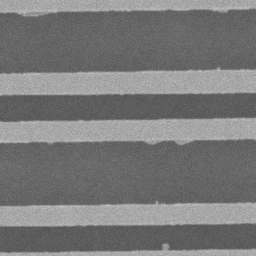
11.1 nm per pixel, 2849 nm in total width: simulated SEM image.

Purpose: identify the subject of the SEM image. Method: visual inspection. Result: lines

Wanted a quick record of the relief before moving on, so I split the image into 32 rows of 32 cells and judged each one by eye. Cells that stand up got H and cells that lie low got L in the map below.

HHHHHHHHHHHHHHHHHHHHHHHHHHHHHHHH
HLLLLLLLLLLLLLLLLLLLLLLLLLLLLLLL
LLLLLLLLLLLLLLLLLLLLLLLLLLLLLLLL
LLLLLLLLLLLLLLLLLLLLLLLLLLLLLLLL
LLLLLLLLLLLLLLLLLLLLLLLLLLLLLLLL
LLLLLLLLLLLLLLLLLLLLLLLLLLLLLLLL
LLLLLLLLLLLLLLLLLLLLLLLLLLLLLLLL
LLLLLLLLLLLLLLLLLLLLLLLLLLLLLLLL
LLLLLLLLLLLLLLLLLLLLLLLLLLLLLLLL
HHHHHHHHHHHHHHHHHHHHHHHHHHHHHHHH
HHHHHHHHHHHHHHHHHHHHHHHHHHHHHHHH
HHHHHHHHHHHHHHHHHHHHHHHHHHHHHHHH
LLLLLLLLLLLLLLLLLLLLLLLLLLLLLLLL
LLLLLLLLLLLLLLLLLLLLLLLLLLLLLLLL
LLLLLLLLLLLLLLLLLLLLLLLLLLLLLLLL
HHHHHHHHHHHHHHHHHHHHHHHHHHHHHHHH
HHHHHHHHHHHHHHHHHHHHHHHHHHHHHHHH
HHHHHHHHHHHHHHHHHHHHHHHLLLLLLLLL
LLLLLLLLLLLLLLLLLLLLLLLLLLLLLLLL
LLLLLLLLLLLLLLLLLLLLLLLLLLLLLLLL
LLLLLLLLLLLLLLLLLLLLLLLLLLLLLLLL
LLLLLLLLLLLLLLLLLLLLLLLLLLLLLLLL
LLLLLLLLLLLLLLLLLLLLLLLLLLLLLLLL
LLLLLLLLLLLLLLLLLLLLLLLLLLLLLLLL
LLLLLLLLLLLLLLLLLLLLLLLLLLLLLLLL
LLLLLLLLLLLLLLLLLLLLLLLLLLLLLLLL
HHHHHHHHHHHHHHHHHHHHHHHHHHHHHHHH
HHHHHHHHHHHHHHHHHHHHHHHHHHHHHHHH
LLLLLLLLLLLLLLLLLLLLLLLLLLLLLLLL
LLLLLLLLLLLLLLLLLLLLLLLLLLLLLLLL
LLLLLLLLLLLLLLLLLLLLLLLLLLLLLLLL
LLLLLLLLLLLLLLLLHHHHHHHHHHHHHHHH